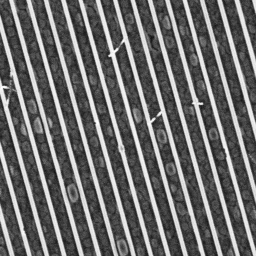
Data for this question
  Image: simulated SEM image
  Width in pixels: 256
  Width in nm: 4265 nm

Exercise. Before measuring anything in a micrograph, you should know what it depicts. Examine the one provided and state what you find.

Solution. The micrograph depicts parallel lines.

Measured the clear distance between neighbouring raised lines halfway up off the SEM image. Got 223 nanometres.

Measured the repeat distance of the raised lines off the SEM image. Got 279 nm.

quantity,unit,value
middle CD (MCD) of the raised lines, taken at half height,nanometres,48.1